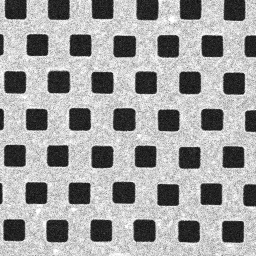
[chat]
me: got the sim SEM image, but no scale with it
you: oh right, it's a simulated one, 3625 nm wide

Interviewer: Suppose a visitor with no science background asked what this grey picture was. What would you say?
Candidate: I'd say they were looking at a regular array of holes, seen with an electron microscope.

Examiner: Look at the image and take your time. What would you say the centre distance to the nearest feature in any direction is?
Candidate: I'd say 601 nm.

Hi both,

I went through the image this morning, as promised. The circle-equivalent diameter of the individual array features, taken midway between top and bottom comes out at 0.349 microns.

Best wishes